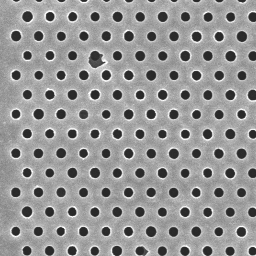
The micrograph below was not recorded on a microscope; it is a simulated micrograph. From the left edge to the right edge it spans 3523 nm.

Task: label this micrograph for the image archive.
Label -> a regular array of holes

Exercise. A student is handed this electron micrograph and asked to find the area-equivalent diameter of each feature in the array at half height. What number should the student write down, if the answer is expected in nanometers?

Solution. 133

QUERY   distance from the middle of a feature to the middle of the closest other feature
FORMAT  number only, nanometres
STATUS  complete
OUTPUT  304